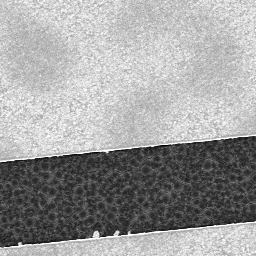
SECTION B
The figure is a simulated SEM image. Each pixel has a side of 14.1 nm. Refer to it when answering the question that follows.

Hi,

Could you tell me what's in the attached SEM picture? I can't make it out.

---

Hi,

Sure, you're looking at one or a few lines or trenches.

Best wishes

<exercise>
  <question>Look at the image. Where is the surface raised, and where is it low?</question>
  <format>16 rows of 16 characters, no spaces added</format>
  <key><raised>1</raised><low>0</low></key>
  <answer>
1111111111111111
1111111111111111
1111111111111111
1111111111111111
1111111111111111
1111111111111111
1111111111111111
1111111111111111
1111111111111111
1111110000000000
0000000000000000
0000000000000000
0000000000000000
0000000000000000
0000000000111111
1111111111111111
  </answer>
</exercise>